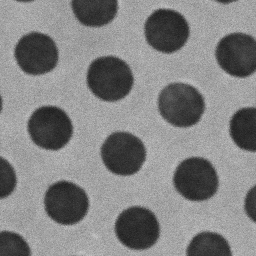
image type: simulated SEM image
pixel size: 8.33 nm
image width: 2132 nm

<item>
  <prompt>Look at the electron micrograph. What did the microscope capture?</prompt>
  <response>a regular array of holes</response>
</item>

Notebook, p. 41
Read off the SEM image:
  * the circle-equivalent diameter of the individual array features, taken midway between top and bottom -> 379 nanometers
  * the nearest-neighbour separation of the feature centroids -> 628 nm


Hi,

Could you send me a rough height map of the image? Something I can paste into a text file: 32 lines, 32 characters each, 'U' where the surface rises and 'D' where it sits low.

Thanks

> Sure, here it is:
UUUUUUUUUDDDDDDUUUUUUUUUUUUUUUUU
UUUUUUUUUDDDDDDUUUUDDDUUUUUUUUUU
UUUUUUUUUUDDDDUUUUDDDDDUUUUUUUUU
UUUUUUUUUUUUUUUUUUDDDDDDUUUUUUUU
UUUDDDUUUUUUUUUUUUDDDDDDUUUUDDDU
UUDDDDDUUUUUUUUUUUUDDDDUUUUDDDDD
UUDDDDDUUUUUUUUUUUUUDDUUUUUDDDDD
UUDDDDDUUUUUDDDUUUUUUUUUUUUDDDDD
UUUDDDDUUUUDDDDDUUUUUUUUUUUUDDDD
UUUUUUUUUUUDDDDDDUUUUUUUUUUUUDDU
UUUUUUUUUUUDDDDDDUUUUDDUUUUUUUUU
UUUUUUUUUUUDDDDDUUUUDDDDDUUUUUUU
UUUUUUUUUUUUUDDUUUUUDDDDDUUUUUUU
UUUUUDDUUUUUUUUUUUUUDDDDDDUUUUDD
UUUUDDDDDUUUUUUUUUUUDDDDDUUUUDDD
UUUDDDDDDUUUUUUUUUUUUDDDUUUUUDDD
UUUUDDDDDUUUUUUDUUUUUUUUUUUUUDDD
UUUUDDDDDUUUUDDDDDUUUUUUUUUUUDDD
UUUUUDDDUUUUUDDDDDUUUUUUUUUUUUDD
UUUUUUUUUUUUUDDDDDUUUUUUUUUUUUUU
DUUUUUUUUUUUUDDDDDUUUUDDDDUUUUUU
DDUUUUUUUUUUUUDDDUUUUUDDDDDUUUUU
DDUUUUUUUUUUUUUUUUUUUUDDDDDUUUUU
DDUUUUDDDDUUUUUUUUUUUUDDDDDUUUUD
DUUUUUDDDDDUUUUUUUUUUUUDDDDUUUUD
UUUUUDDDDDDUUUUUUUUUUUUUUUUUUUUD
UUUUUUDDDDDUUUUDDDDUUUUUUUUUUUUD
UUUUUUUDDDUUUUUDDDDDUUUUUUUUUUUD
UUUUUUUUUUUUUUDDDDDDUUUUUUUUUUUU
DDDUUUUUUUUUUUUDDDDDUUUUDDDDUUUU
DDDUUUUUUUUUUUUDDDDUUUUUDDDDDUUU
DDDDUUUUUUUUUUUUUUUUUUUDDDDDDUUU